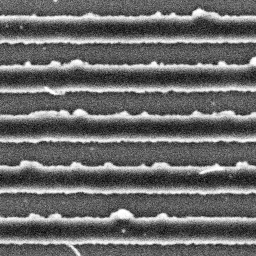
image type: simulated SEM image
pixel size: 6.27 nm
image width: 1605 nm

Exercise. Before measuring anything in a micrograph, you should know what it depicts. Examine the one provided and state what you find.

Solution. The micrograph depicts lines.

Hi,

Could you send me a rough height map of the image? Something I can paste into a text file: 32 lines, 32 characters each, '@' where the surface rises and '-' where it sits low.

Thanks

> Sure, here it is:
--------------------------------
------------------------@@------
@@@@@@@@@@@@@@@@@@@@@@@@@@@@@@@@
@@@@@@@@@@@@@@@@@@@@@@@@@@@@@@@@
@@@@@@@@@@@@@@@@@@@@@@@@@@@@@@@@
--------------------------------
--------------------------------
--------------------------------
@@@@@@@@@@@@@@@@@@@@@@@@@@@@@@@@
@@@@@@@@@@@@@@@@@@@@@@@@@@@@@@@@
@@@@@@@@@@@@@@@@@@@@@@@@@@@@@@@@
------@-------------------------
--------------------------------
--------------------------------
@@@@@@@@@@@@@@@@@@@@@@@@@@@@@@@@
@@@@@@@@@@@@@@@@@@@@@@@@@@@@@@@@
@@@@@@@@@@@@@@@@@@@@@@@@@@@@@@@@
@@@@@@@@@@@@@@@@@@@@@@@@@@@@@@@@
--------------------------------
--------------------------------
---@@----@---@----------------@-
@@@@@@@@@@@@@@@@@@@@@@@@@@@@@@@@
@@@@@@@@@@@@@@@@@@@@@@@@@@@@@@@@
@@@@@@@@@@@@@@@@@@@@@@@@@@@@@@@@
--------------------------------
--------------------------------
--------------@@----------------
@@@@@@@@@@@@@@@@@@@@@@@@@@@@@@@@
@@@@@@@@@@@@@@@@@@@@@@@@@@@@@@@@
@@@@@@@@@@@@@@@@@@@@@@@@@@@@@@@@
--------------------@-----------
--------------------------------